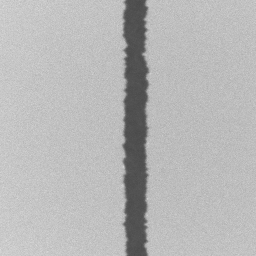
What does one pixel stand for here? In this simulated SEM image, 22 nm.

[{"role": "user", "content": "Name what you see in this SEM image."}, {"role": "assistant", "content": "one or a few lines or trenches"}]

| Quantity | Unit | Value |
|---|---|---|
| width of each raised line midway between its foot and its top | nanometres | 508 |